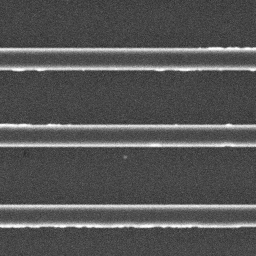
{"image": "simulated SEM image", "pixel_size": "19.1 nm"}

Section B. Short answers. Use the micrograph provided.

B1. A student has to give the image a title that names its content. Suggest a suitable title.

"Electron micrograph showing lines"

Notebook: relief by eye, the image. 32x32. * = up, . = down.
................................
................................
................................
................................
................................
................................
********************************
********************************
********************************
................................
................................
................................
................................
................................
................................
................................
********************************
********************************
................................
................................
................................
................................
................................
................................
................................
................................
********************************
********************************
................................
................................
................................
................................